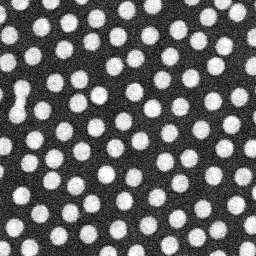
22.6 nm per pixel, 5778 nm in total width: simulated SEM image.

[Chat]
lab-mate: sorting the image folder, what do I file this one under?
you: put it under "a regular array of raised bodies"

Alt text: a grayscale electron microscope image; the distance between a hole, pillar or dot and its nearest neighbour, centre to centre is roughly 25.9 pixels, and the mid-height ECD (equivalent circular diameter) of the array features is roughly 360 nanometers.